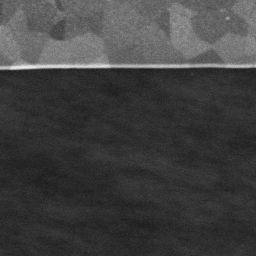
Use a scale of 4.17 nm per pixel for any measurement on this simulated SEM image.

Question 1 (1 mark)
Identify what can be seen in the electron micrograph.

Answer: wiring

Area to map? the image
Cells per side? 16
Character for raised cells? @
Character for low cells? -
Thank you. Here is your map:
@@@@@@@@@@@@@@@@
@@@@@@@@@@@@@@@@
@@@@@@@@@@@@@@@@
@@@@@@@@@@@@@@@@
----------------
----------------
----------------
----------------
----------------
----------------
----------------
----------------
----------------
----------------
----------------
----------------